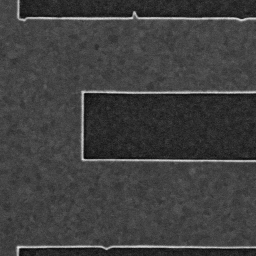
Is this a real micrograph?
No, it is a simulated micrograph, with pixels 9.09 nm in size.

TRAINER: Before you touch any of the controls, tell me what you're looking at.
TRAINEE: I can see one or a few lines or trenches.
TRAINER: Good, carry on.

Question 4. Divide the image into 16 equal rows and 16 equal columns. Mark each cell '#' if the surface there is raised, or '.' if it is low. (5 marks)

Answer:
#...............
################
################
################
################
################
#####...........
#####...........
#####...........
#####...........
################
################
################
################
################
##..............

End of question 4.